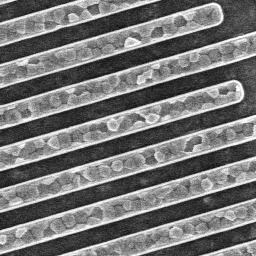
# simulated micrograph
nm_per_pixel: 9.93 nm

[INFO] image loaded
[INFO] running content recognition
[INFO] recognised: parallel lines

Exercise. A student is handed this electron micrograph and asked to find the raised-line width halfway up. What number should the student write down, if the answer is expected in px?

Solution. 22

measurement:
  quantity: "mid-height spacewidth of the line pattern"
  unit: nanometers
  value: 184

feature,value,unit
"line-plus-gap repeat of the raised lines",396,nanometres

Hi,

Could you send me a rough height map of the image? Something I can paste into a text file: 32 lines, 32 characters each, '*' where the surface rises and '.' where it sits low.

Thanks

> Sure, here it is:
........**********........*.....
.....**********........*****....
.**********........*********....
*******.........**********......
****........**********........**
*........**********........*****
......*********.........********
..**********........**********..
********.........*********......
*****........**********.........
*.........*********.........**..
......**********........******..
...**********........*********..
*********........**********.....
******........**********........
**........**********........****
.......**********........*******
...**********.........*********.
**********........**********....
******.........*********........
***........**********........***
........*********.........******
....**********........**********
.*********.........*********....
*******........**********.......
***.........**********........**
........**********........******
.....**********........*********
.**********.........*********...
********........**********......
****.........*********........**
*........**********........*****